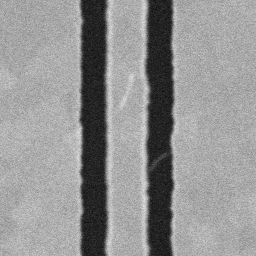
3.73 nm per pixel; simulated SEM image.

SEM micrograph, lines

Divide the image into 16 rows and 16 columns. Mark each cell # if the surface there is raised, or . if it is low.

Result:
#####..##..#####
#####..##..#####
#####..##..#####
#####..##..#####
#####..##..#####
#####..##..#####
#####..##..#####
#####..##..#####
#####..##..#####
#####..##..#####
#####..##..#####
#####..##..#####
#####..##..#####
#####..##..#####
#####..##..#####
#####..##..#####